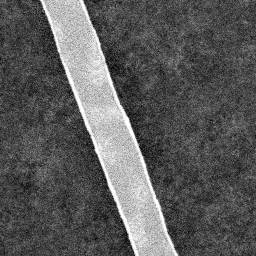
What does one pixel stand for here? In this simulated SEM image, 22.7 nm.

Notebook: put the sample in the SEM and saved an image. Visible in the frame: one or a few lines or trenches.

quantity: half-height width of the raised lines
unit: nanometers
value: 861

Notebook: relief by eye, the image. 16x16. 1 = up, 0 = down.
0001100000000000
0001110000000000
0000110000000000
0000110000000000
0000111000000000
0000011000000000
0000011000000000
0000011100000000
0000001100000000
0000001110000000
0000001110000000
0000000110000000
0000000111000000
0000000011000000
0000000011000000
0000000011100000